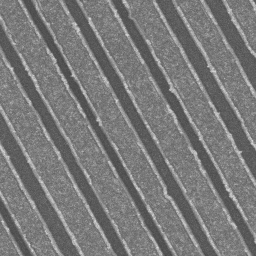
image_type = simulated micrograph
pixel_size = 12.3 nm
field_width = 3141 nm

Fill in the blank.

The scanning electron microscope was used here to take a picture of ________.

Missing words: parallel lines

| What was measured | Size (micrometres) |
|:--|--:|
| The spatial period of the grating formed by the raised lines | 0.494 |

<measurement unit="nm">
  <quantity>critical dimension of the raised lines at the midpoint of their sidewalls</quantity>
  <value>346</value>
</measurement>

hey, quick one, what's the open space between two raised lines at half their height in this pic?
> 147 nm